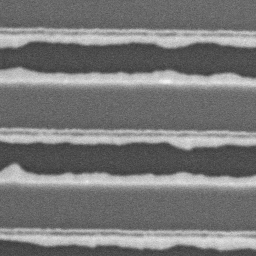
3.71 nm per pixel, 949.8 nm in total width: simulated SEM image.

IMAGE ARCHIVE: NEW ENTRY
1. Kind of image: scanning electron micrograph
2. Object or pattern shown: lines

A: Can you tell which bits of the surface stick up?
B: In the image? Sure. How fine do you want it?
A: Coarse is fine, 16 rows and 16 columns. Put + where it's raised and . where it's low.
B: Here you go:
++++++++++++++++
++++++++++++++++
+........+++.+++
................
................
++++++++++++++++
++++++++++++++++
++++++++++++++++
++++++++++++++++
................
................
++++++++++++++++
++++++++++++++++
++++++++++++++++
++++++++++++++++
................